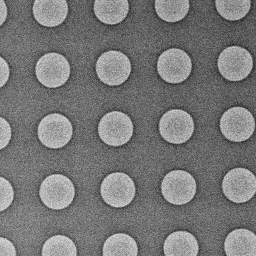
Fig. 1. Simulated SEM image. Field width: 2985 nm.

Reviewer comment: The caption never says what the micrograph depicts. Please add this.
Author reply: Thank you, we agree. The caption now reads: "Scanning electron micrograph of an array of small figures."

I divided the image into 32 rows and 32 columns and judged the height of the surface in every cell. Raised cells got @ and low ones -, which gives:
@---@@@@----@@@@---@@@@@---@@@@-
@---@@@@----@@@@----@@@----@@@@-
@----@@@-----@@------@----------
--------------------------------
--------------------------------
--------------------------------
-------------@@------@@-----@@@-
-----@@@----@@@@----@@@@---@@@@-
@----@@@@---@@@@----@@@@---@@@@-
@----@@@@---@@@@----@@@-----@@@-
-----@@@-----@@-----------------
--------------------------------
--------------------------------
-----------------------------@--
------@@-----@@@----@@@@----@@@-
@----@@@@---@@@@----@@@@----@@@@
@----@@@@---@@@@@---@@@@----@@@@
@----@@@@----@@@-----@@------@--
--------------------------------
--------------------------------
--------------------------------
---------------------@@------@@-
@-----@@@----@@@----@@@@----@@@@
@@---@@@@----@@@@---@@@@----@@@@
@@---@@@@----@@@@----@@@----@@@@
@-----@@@-----@@------@---------
--------------------------------
--------------------------------
--------------------------------
--------------@@-----@@@-----@@@
@-----@@@----@@@@----@@@@---@@@@
@@---@@@@@---@@@@----@@@@---@@@@